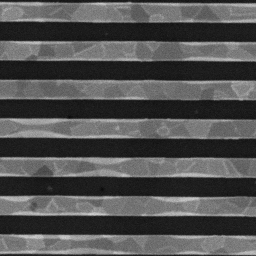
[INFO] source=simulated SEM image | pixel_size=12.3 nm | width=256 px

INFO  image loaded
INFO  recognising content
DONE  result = wiring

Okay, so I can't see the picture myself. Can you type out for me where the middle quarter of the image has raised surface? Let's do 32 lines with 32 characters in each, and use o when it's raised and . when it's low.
................................
................................
................................
................................
ooooooooooooooooooooooooooooooo.
oooooooooooooooooooooooooooooooo
oooooooooooooooooooooooooooooooo
oooooooooooooooooooooooooooooooo
oooooooooooooooo..oooooooooooooo
................................
................................
................................
................................
................................
oooooooooooooooooooooooooooooooo
oooooooooooooooooooooooooooooooo
oooooooooooooooooooooooooooooooo
oooooooooooooooooooooooooooooooo
....................oooooo.....o
................................
................................
................................
................................
................................
oooooooooooooooooooooooooooooooo
oooooooooooooooooooooooooooooooo
oooooooooooooooooooooooooooooooo
oooooo......oooooooooooooooooooo
................................
................................
................................
................................